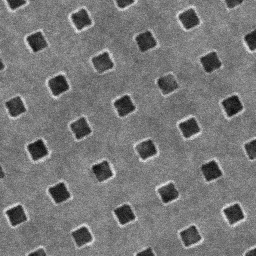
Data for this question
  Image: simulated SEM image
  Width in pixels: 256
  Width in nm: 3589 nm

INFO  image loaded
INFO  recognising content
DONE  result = a regular array of holes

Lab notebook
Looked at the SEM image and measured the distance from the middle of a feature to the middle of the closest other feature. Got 676 nanometres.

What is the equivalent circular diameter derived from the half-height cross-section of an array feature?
0.289 µm